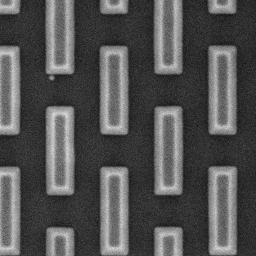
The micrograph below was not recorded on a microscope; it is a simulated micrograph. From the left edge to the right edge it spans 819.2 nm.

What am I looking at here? groups of lines, slits or small figures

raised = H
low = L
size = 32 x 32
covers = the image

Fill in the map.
HHLLLLHHHLLLLHHLLLLLHHLLLLLHHLLL
LLLLLLHHHLLLLLLLLLLLHHLLLLLLLLLL
LLLLLLHHHLLLLLLLLLLLHHLLLLLLLLLL
LLLLLLHHHLLLLLLLLLLLHHLLLLLLLLLL
LLLLLLHHHLLLLLLLLLLLHHLLLLLLLLLL
LLLLLLHHHLLLLLLLLLLLHHLLLLLLLLLL
HHLLLLHHHLLLLHHLLLLLHHLLLLLHHLLL
HHLLLLHHHLLLLHHLLLLLHHLLLLLHHLLL
HHLLLLHHHLLLLHHLLLLLHHLLLLLHHLLL
HHLLLLLLLLLLLHHHLLLLLLLLLLLHHLLL
HHLLLLLLLLLLLHHHLLLLLLLLLLLHHLLL
HHLLLLLLLLLLLHHHLLLLLLLLLLLHHLLL
HHLLLLLLLLLLLHHHLLLLLLLLLLLHHLLL
HHLLLLLLLLLLLHHHLLLLLLLLLLLHHLLL
HHLLLLHHHLLLLHHHLLLLHHLLLLLHHLLL
HHLLLLHHHLLLLHHHLLLLHHLLLLLHHLLL
LLLLLLHHHLLLLLLLLLLLHHLLLLLLLLLL
LLLLLLHHHLLLLLLLLLLLHHLLLLLLLLLL
LLLLLLHHHLLLLLLLLLLLHHLLLLLLLLLL
LLLLLLHHHLLLLLLLLLLLHHLLLLLLLLLL
LLLLLLHHHLLLLLLLLLLLHHLLLLLLLLLL
HHLLLLHHHLLLLHHLLLLLHHLLLLLHHLLL
HHLLLLHHHLLLLHHHLLLLHHLLLLLHHLLL
HHLLLLHHHLLLLHHHLLLLHHLLLLLHHLLL
HHLLLLLLLLLLLHHHLLLLLLLLLLLHHLLL
HHLLLLLLLLLLLHHHLLLLLLLLLLLHHLLL
HHLLLLLLLLLLLHHHLLLLLLLLLLLHHLLL
HHLLLLLLLLLLLHHHLLLLLLLLLLLHHLLL
HHLLLLLLLLLLLHHHLLLLLLLLLLLHHLLL
HHLLLLHHHLLLLHHHLLLLHHLLLLLHHLLL
HHLLLLHHHLLLLHHHLLLLHHLLLLLHHLLL
HLLLLLHHHLLLLHHLLLLLHHLLLLLLLLLL